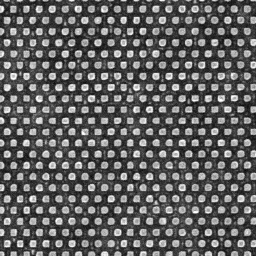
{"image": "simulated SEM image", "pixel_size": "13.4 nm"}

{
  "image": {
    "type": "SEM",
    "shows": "a regular array of raised bodies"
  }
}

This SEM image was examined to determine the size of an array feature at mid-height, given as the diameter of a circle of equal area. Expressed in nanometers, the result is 93.3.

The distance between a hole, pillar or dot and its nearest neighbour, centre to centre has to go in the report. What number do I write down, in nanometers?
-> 170